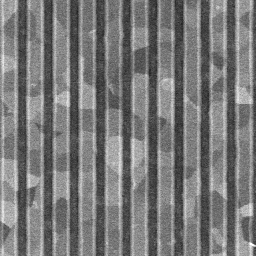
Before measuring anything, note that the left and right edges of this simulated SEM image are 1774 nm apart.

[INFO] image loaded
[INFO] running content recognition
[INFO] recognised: parallel lines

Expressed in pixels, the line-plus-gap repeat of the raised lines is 26.1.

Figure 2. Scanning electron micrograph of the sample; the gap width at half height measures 71.9 nanometres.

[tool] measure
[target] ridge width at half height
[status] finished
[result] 108 nm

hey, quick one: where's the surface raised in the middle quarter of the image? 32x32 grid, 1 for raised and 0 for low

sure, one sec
10001111000111000111100011100011
10001111000111000111100011100011
10001111000111000111100011100011
10001111000111000111100011100011
10001111000111000111100011100011
10001111000111000111100011100011
10001111000111000111100011100011
10001111000111000111100011100011
10001111000111000111100011100011
10001111000111000111100011100011
10001111000111000111100011100011
10001111000111000111100011100011
10001111000111000111100011100011
10001111000111000111100011100011
10001111000111000111100011100011
10001111000111000111100011100011
10001111000111000111100011100011
10001111000111000111100011100011
10001111000111000111100011100011
10001111000111000111100011100011
10001111000111000111100011100011
10001111000111000111100011100011
10001111000111000111100011100011
10001111000111000111100011100011
10001110000111000111100011100011
10001110000111000111100011100011
10001111000111000111100011100011
10001111000111000111100011100011
10001111000111000111100011100011
10001111000111000111100011100011
10001111000111000111100011100011
10001111000111000111100011100011